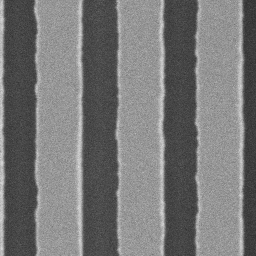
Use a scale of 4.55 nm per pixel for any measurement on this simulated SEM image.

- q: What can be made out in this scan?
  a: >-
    lines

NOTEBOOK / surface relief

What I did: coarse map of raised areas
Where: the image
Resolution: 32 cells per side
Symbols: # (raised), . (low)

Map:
....######.....#####.....#####..
....######.....#####.....#####..
.....#####.....#####.....#####..
.....#####.....#####.....#####..
.....#####.....#####....######..
.....#####.....#####....######..
.....#####.....######...######..
....######.....#####.....#####..
.....#####.....#####....######..
.....#####.....#####....######..
.....#####.....######....#####..
....######.....######....#####..
.....#####.....######....#####..
.....#####.....#####.....#####..
.....#####.....#####....######..
.....#####.....#####....######..
.....#####.....#####.....#####..
....######.....######....#####..
.....#####.....######....#####..
.....#####.....#####.....#####..
....######.....#####.....#####..
#...######.....#####.....#####..
#...######.....#####....######..
.....#####.....#####.....#####..
.....#####.....#####.....#####..
.....#####.....######....#####..
....######.....######....#####..
....######.....######....#####..
.....#####.....######...######..
.....#####.....######...######..
.....#####.....#####....######..
.....#####.....#####.....#####..